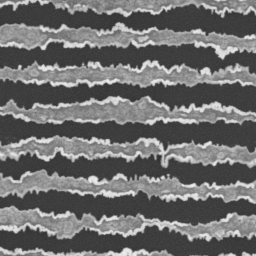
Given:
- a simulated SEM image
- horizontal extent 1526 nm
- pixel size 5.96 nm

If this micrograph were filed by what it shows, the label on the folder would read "parallel lines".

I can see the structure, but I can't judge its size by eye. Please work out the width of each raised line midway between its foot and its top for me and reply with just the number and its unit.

102 nanometres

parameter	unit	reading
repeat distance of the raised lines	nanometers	221